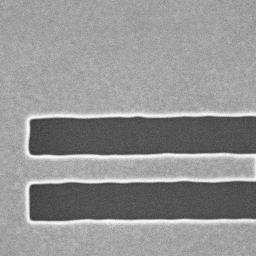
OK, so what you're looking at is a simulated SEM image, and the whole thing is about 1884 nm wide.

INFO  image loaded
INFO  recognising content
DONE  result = groups of lines, slits or small figures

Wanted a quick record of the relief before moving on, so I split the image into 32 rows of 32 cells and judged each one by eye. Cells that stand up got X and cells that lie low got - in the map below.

XXXXXXXXXXXXXXXXXXXXXXXXXXXXXXXX
XXXXXXXXXXXXXXXXXXXXXXXXXXXXXXXX
XXXXXXXXXXXXXXXXXXXXXXXXXXXXXXXX
XXXXXXXXXXXXXXXXXXXXXXXXXXXXXXXX
XXXXXXXXXXXXXXXXXXXXXXXXXXXXXXXX
XXXXXXXXXXXXXXXXXXXXXXXXXXXXXXXX
XXXXXXXXXXXXXXXXXXXXXXXXXXXXXXXX
XXXXXXXXXXXXXXXXXXXXXXXXXXXXXXXX
XXXXXXXXXXXXXXXXXXXXXXXXXXXXXXXX
XXXXXXXXXXXXXXXXXXXXXXXXXXXXXXXX
XXXXXXXXXXXXXXXXXXXXXXXXXXXXXXXX
XXXXXXXXXXXXXXXXXXXXXXXXXXXXXXXX
XXXXXXXXXXXXXXXXXXXXXXXXXXXXXXXX
XXXXXXXXXXXXXXXXXXXXXXXXXXXXXXXX
XXXXXXXXXXXXXXXXX-XXXX----------
XXXX----------------------------
XXXX----------------------------
XXXX----------------------------
XXX-----------------------------
XXXX-----XXX----XXXXXXXXXXXXXXXX
XXXXXXXXXXXXXXXXXXXXXXXXXXXXXXXX
XXXXXXXXXXXXXXXXXXXXXXXXXXXXXXXX
XXXXXXXXXXXXXXXXXXXXXXXXXXXXXXXX
XXXX----------------------------
XXXX----------------------------
XXXX----------------------------
XXXX----------------------------
XXXX----------------------------
XXXXXXXXXXXXXXXXXXXXXXXXXXXXXXXX
XXXXXXXXXXXXXXXXXXXXXXXXXXXXXXXX
XXXXXXXXXXXXXXXXXXXXXXXXXXXXXXXX
XXXXXXXXXXXXXXXXXXXXXXXXXXXXXXXX